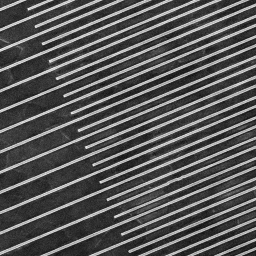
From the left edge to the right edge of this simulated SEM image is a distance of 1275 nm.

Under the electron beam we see parallel lines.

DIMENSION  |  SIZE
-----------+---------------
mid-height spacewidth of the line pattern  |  31.6 nm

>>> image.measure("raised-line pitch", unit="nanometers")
46.6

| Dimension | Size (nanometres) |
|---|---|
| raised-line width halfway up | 12.6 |